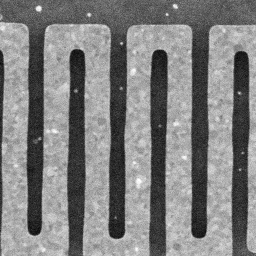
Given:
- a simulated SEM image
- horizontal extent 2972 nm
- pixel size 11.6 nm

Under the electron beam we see groups of lines, slits or small figures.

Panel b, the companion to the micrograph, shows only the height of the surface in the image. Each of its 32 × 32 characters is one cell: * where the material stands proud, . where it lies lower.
................................
................................
................................
***...********..********...*****
****..********..********..******
****..********..********..******
****..***.****..***..***..****.*
.***..***..***..***..***..***..*
.***..***..***..***..***..***..*
.**...***..***..***..***..***..*
.***..***..***..***..***..***..*
.***..***..***..***..***..***..*
.***..***..***..***..***..***..*
****..***..***..***..***..***..*
****..***..***..***..***..***..*
***...***..***..***..***..***..*
***...***..***..***..***..***..*
***...***..***..***..***..***..*
***...***..***..***..***..***..*
***...**...***..***..***..***..*
***...**...***..***..***..***..*
***..***...***..***..***..***..*
***..***...***..***..***..***..*
***..***...***..***..***..***..*
***..***...***..***..***..***..*
***..***...***..***..***..***..*
***..***...***..***..***..***..*
***..***...***..***..***..***..*
****.****..***..***..***..***..*
*********.****.****..***.****..*
*********.*********..********..*
*********.*********..********..*